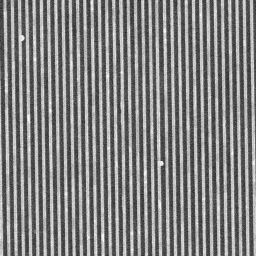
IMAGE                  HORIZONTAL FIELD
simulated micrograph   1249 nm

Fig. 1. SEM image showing parallel lines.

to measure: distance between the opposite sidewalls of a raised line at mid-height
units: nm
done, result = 11.6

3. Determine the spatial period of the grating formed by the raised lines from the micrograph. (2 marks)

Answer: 35.4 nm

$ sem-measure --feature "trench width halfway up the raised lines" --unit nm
23.8